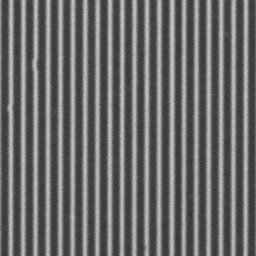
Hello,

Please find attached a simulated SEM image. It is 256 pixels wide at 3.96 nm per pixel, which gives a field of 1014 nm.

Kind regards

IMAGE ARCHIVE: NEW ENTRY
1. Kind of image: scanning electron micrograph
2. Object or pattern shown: parallel lines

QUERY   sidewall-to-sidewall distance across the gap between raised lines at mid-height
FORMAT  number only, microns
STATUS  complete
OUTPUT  0.0352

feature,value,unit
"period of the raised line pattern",49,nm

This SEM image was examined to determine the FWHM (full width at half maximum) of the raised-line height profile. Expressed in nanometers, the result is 14.4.